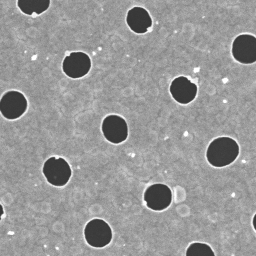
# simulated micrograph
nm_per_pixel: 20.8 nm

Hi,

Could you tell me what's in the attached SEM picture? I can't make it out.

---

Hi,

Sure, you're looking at a regular array of holes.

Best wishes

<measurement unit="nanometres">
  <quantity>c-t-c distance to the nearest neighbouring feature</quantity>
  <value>1500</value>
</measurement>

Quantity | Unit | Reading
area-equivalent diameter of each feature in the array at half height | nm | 571